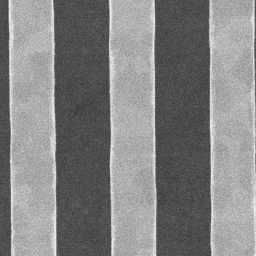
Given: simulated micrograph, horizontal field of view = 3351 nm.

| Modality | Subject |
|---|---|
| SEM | wiring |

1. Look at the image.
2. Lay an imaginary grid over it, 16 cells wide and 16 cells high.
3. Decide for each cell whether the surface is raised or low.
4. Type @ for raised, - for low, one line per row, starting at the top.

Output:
-@@----@@@---@@@
-@@----@@@---@-@
-@@----@@@---@@@
-@@----@@@---@@@
-@@----@@@---@@@
-@@----@@@---@@@
-@@----@@@---@@@
-@@----@@@---@@@
-@@----@@@---@@@
-@@----@@@---@@@
-@@----@@@---@@@
-@@----@@@---@@@
-@@----@@@---@@@
-@@----@@@---@@@
-@@----@@@---@@@
-@@----@@@---@@@